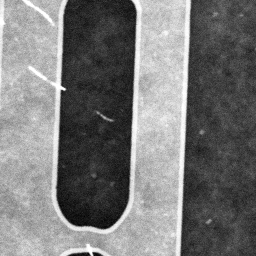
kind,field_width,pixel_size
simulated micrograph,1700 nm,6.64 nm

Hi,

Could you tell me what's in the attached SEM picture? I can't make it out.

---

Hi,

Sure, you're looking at one or a few lines or trenches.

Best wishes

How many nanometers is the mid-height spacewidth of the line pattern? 514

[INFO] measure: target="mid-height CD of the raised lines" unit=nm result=328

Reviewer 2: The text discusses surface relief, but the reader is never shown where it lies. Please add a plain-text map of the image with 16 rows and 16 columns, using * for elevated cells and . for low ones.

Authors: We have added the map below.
****.....***....
****.....***....
****.....***....
****.....***....
****.....***....
****.....***....
****....****....
****....***.....
****....***.....
***.....***.....
***.....***.....
***.....***.....
***.....***.....
****....***.....
***********.....
***********.....